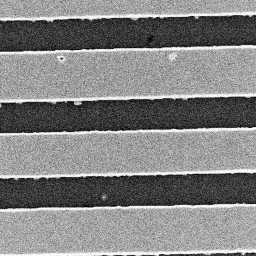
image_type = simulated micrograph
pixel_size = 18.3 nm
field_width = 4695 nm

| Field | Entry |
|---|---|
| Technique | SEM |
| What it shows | lines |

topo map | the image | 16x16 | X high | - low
XXXXXXXXXXXXXXXX
----------------
----------------
XXXXXXXXXXXXXXXX
XXXXXXXXXXXXXXXX
XXXXXXXXXXXXXXXX
----------------
----------------
XXXXXXXXXXXXXXXX
XXXXXXXXXXXXXXXX
XXXXXXXXXXXXXXXX
----------------
----------------
XXXXXXXXXXXXXXXX
XXXXXXXXXXXXXXXX
XXXXXXXXXXXXXXXX